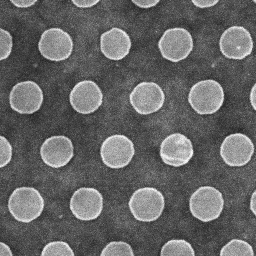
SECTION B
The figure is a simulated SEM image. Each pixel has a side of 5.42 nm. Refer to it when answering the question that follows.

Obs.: a regular array of raised bodies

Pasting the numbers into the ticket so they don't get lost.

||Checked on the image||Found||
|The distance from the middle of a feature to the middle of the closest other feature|324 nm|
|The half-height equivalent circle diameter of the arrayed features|0.177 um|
